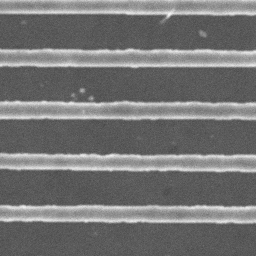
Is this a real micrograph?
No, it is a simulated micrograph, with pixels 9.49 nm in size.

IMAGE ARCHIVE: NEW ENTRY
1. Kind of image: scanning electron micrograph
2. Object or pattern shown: lines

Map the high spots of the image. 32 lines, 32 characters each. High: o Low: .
oooooooooooooooooooooooooooooooo
oooooooooooooooooooooooooooooooo
................................
................................
................................
................................
oooooooooooooooooooooooooooooooo
oooooooooooooooooooooooooooooooo
................................
................................
................................
................................
................................
oooooooooooooooooooooooooooooooo
oooooooooooooooooooooooooooooooo
................................
................................
................................
................................
oooooooooooooooooo.ooooooooo.ooo
oooooooooooooooooooooooooooooooo
................................
................................
................................
................................
................................
oooooooooooooooooooooooooooooooo
oooooooooooooooooooooooooooooooo
................................
................................
................................
................................